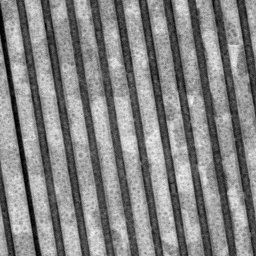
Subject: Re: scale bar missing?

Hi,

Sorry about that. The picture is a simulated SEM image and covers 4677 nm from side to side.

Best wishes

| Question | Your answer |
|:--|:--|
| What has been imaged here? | parallel lines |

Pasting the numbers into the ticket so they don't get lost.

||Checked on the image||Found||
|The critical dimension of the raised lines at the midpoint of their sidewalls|286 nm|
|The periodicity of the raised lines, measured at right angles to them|0.442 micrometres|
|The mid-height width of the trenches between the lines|160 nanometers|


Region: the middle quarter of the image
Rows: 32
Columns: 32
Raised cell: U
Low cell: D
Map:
UUUDDUUUUDDUUUUDDUUUUDDDUUUDDDUU
UUUDDUUUUDDUUUUDDDUUUDDDUUUDDDUU
UUUDDUUUUDDDUUUDDDUUUUDDUUUUDDUU
UUUDDDUUUDDDUUUUDDUUUUDDUUUUDDUU
UUUDDDUUUUDDUUUUDDUUUUDDUUUUDDUU
UUUUDDUUUUDDUUUUDDUUUUDDUUUUDDDU
UUUUDDUUUUDDUUUUDDUUUUDDDUUUDDDU
UUUUDDUUUUDDUUUUDDDUUUDDDUUUDDDU
UUUUDDUUUUDDDUUUDDDUUUDDDUUUUDDU
UUUUDDDUUUDDDUUUUDDUUUUDDUUUUDDU
DUUUDDDUUUUDDUUUUDDUUUUDDUUUUDDU
DUUUUDDUUUUDDUUUUDDUUUUDDUUUUDDU
DUUUUDDUUUUDDUUUUDDUUUUDDDUUUDDD
DUUUUDDUUUUDDUUUUDDDUUUDDDUUUDDD
DUUUUDDUUUUDDDUUUDDDUUUDDDUUUUDD
DDUUUDDDUUUDDDUUUUDDUUUDDDUUUUDD
DDUUUDDDUUUUDDUUUUDDUUUUDDUUUUDD
DDUUUUDDUUUUDDUUUUDDUUUUDDUUUUDD
DDUUUUDDUUUUDDUUUUDDUUUUDDDUUUDD
DDUUUUDDUUUUDDUUUUDDDUUUDDDUUUDD
DDUUUUDDUUUUDDDUUUDDDUUUDDDUUUDD
DDDUUUDDDUUUDDDUUUUDDUUUDDDUUUUD
DDDUUUDDDUUUUDDUUUUDDUUUUDDUUUUD
DDDUUUDDDUUUUDDUUUUDDUUUUDDUUUUD
DDDUUUUDDUUUUDDUUUUDDUUUUDDDUUUD
UDDUUUUDDUUUUDDUUUUDDDUUUDDDUUUD
UDDUUUUDDUUUUDDUUUUDDDUUUDDDUUUD
UDDDUUUDDUUUUDDDUUUDDDUUUDDDUUUU
UDDDUUUDDDUUUDDDUUUUDDUUUUDDUUUU
UDDDUUUDDDUUUUDDUUUUDDUUUUDDUUUU
UDDDUUUUDDUUUUDDUUUUDDUUUUDDUUUU
UUDDUUUUDDUUUUDDUUUUDDUUUUDDDUUU